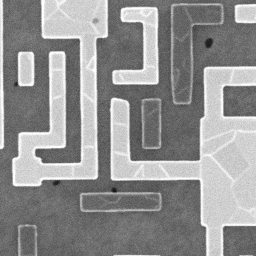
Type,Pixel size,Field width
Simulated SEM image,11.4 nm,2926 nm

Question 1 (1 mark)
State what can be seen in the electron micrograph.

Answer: wiring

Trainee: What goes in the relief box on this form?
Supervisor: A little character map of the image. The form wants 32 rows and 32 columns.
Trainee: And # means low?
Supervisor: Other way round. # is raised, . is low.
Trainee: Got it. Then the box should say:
.....########...................
.....########..#####..######..##
.....########..#####..######..##
.....########.....##..##........
.....########.....##..##........
..........##......##..##........
..........##......##..##........
..##..##..##......##..##........
..##..##..##......##..##..######
..##..##..##..######..##..######
...#..##..##..........##..######
......##..##..........##..##....
......##..##..#...##..##..##....
......##..##..##..##......##....
......##..##..##..##......##....
......##..##..##..##.....#######
......##..##..##..##.....#######
..######..##..##..##.....#######
..###.....##..##.........#######
..###.....##..##.........#######
..####...###..##################
..##########..##################
..###....................#######
.........................#######
..........##########.....#######
..........##########.....#######
.........................#######
.........................#######
..##......................##....
..##......................##....
..##......................##....
..##......................##....